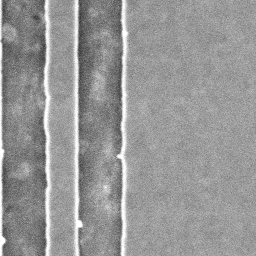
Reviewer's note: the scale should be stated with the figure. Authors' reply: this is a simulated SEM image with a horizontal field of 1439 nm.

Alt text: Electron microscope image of one or a few lines or trenches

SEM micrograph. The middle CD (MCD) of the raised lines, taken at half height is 174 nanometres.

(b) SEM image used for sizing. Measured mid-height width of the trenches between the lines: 253 nm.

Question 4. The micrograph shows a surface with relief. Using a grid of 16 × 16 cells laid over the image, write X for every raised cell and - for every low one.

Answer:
---XX---XXXXXXXX
---XX---XXXXXXXX
---XX---XXXXXXXX
---XX---XXXXXXXX
---XX---XXXXXXXX
---XX---XXXXXXXX
---XX---XXXXXXXX
---XX---XXXXXXXX
---XX---XXXXXXXX
---XX---XXXXXXXX
---XX---XXXXXXXX
---XX---XXXXXXXX
---XX---XXXXXXXX
---XX---XXXXXXXX
---XX---XXXXXXXX
---XX---XXXXXXXX